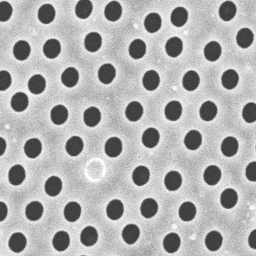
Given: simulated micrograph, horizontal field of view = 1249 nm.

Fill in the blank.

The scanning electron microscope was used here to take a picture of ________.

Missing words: a regular array of holes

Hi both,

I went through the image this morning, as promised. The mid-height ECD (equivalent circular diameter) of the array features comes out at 19.5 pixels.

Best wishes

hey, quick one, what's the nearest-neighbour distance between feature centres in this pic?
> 158 nm